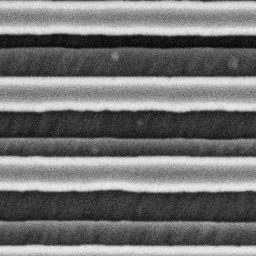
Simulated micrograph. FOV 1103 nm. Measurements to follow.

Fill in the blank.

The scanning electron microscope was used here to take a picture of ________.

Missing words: lines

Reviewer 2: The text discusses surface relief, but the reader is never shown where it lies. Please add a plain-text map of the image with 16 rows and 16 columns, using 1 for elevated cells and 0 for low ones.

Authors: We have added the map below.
1111111111111111
1111111111111111
0000000000000000
0000000000000000
0000000000000000
1111111111111111
1111111111111111
0000000000000000
0000000000000000
0000000000000000
1111111111111111
1111111111111111
0000000000000000
0000000000000000
0000000000000000
1111111111111111